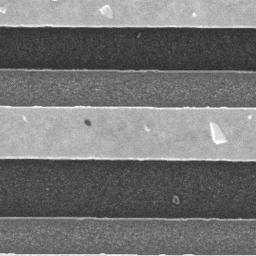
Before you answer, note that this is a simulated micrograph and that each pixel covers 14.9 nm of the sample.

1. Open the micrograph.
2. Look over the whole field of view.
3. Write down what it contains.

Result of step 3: lines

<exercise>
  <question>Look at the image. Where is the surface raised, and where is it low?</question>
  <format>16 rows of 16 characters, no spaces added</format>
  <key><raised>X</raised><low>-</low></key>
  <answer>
XXXXXXXXXXXXXXXX
XXXXXXXXXXXXXXXX
----------------
----------------
XXXXXXXXXXXXXXXX
XXXXXXXXXXXXXXXX
XXXXXXXXXXXXXXXX
XXXXXXXXXXXXXXXX
XXXXXXXXXXXXXXXX
XXXXXXXXXXXXXXXX
----------------
----------------
----------------
----------------
XXXXXXXXXXXXXXXX
XXXXXXXXXXXXXXXX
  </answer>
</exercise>